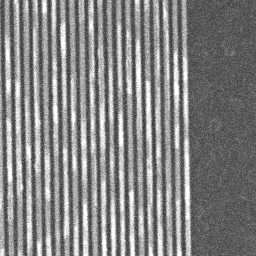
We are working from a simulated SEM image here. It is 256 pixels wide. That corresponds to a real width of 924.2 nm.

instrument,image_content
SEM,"parallel lines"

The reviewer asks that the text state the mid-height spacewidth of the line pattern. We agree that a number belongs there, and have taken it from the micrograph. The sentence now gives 17.1 nanometers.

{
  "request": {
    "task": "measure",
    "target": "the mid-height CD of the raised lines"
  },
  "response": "17.1 nm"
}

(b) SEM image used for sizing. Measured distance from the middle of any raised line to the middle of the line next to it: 33.6 nm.